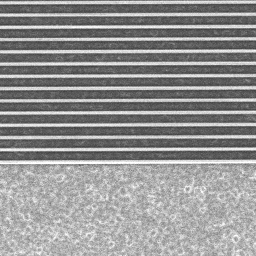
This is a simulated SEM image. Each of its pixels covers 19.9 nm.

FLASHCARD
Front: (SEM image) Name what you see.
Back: parallel lines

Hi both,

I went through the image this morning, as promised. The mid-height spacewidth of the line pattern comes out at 184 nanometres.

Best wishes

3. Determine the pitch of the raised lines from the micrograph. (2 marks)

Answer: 243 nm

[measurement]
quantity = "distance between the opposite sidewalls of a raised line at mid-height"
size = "54.6 nm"